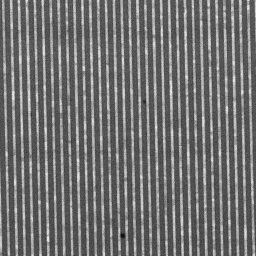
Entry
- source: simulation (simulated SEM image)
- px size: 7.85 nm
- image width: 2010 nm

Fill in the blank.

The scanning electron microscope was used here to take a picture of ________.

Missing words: parallel lines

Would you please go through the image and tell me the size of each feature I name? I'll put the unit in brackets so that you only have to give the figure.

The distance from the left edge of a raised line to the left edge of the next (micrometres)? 0.062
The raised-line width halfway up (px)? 1.75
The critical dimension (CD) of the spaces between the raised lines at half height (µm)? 0.051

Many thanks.